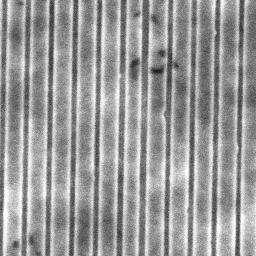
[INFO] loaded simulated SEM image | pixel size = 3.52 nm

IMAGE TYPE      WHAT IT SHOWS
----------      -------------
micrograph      parallel lines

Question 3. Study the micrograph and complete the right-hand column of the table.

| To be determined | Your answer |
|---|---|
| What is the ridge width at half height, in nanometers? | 65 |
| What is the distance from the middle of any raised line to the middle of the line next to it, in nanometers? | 83.4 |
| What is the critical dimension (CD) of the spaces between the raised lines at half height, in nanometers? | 20.7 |